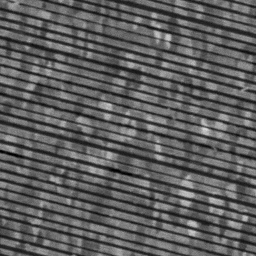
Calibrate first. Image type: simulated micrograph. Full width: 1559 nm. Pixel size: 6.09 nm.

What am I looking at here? parallel lines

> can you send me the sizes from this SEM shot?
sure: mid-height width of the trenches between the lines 25.8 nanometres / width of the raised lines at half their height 31.7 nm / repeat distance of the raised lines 0.0559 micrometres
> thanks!